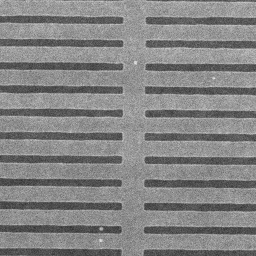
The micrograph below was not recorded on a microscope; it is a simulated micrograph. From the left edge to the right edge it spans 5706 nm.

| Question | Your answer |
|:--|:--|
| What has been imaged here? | groups of lines, slits or small figures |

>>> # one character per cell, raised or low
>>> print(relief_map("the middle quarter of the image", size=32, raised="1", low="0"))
00000000000000011111000000000000
00000000000000011111000000000000
11111111111111111111111111111111
11111111111111111111111111111111
11111111111111111111111111111111
00000000000000111111100111111111
00000000000000011111000000000000
00011100000000111111100000000000
11111111111111111111111111111111
11111111111111111111111111111111
11111111111111111111111111111111
00000000000000011111100000000000
00000000000000011111000000000000
11111111111110111111100000000000
11111111111111111111111111111111
11111111111111111111111111111111
11111111111111111111111111111111
00000000000000011111000000000000
00000000000000011111000000000000
11111111111111111111111111111111
11111111111111111111111111111111
11111111111111111111111111111111
11111111111111111111111111111111
00000000000000011111000000000000
00000000000000011111000000000000
11111111111111111111111111111111
11111111111111111111111111111111
11111111111111111111111111111111
11111111111111111111111111111111
00000000000000011111000000000000
00000000000000011111000000000000
11111111111111111111111111111111